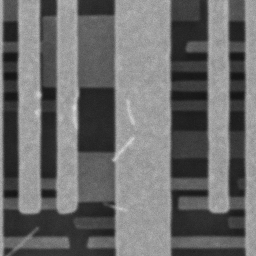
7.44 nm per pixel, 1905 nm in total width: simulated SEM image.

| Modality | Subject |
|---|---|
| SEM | wiring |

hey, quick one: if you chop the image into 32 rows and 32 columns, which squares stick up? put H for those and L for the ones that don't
LLHHHLLHHHLLLLHHHHHHHLLLLLHHLLLH
LLHHHLLHHHLLLLHHHHHHHLLLLLHHHLLH
LLHHHLLHHHLLLLHHHHHHHLLLLLHHHLLH
LLHHHLLHHHLLLLHHHHHHHLLLLLHHHLLH
LLHHHLLHHHLLLLHHHHHHHLLLLLHHHLLH
LLHHHLLHHHLLLLHHHHHHHLLLLLHHHLLH
LLHHHLLHHHLLLLHHHHHHHLLLLLHHHLLH
LLHHHLLHHHLLLLHHHHHHHLLLLLHHHLLH
LLHHHLLHHHLLLLHHHHHHHLLLLLHHHLLH
LLHHHLLHHHLLLLHHHHHHHLLLLLHHHLLH
LLHHHLLHHHLLLLHHHHHHHLLLLLHHHLLH
LLHHHLLHHHLLLLHHHHHHHLLLLLHHHLLH
LLHHHLLHHHLLLLHHHHHHHLLLLLHHHLLH
LLHHHLLHHHLLLLHHHHHHHLLLLLHHHLLH
LLHHHLLHHHLLLLHHHHHHHLLLLLHHHLLH
LLHHHLLHHHLLLLHHHHHHHLLLLLHHHLLH
LLHHHLLHHHLLLLLHHHHHHLLLLLHHHLLH
LLHHHLLHHHLLLLLHHHHHHLLLLLHHHLLH
LLHHHLLHHHLLLLHHHHHHHLLLLLHHHLLH
LLHHHLLHHHLLLLHHHHHHHLLLLLHHHLLH
LLLHHLLHHHLLLLHHHHHHHLLLLLHHHLLH
LLHHHLLHHHLLLLHHHHHHHLLLLLHHHLLH
LLHHHLLHHHLLLLHHHHHHHLLLLLHHLLLH
LLHHHLLHHHLLLLHHHHHHHLLLLLHHHLLH
LLHHHLLHHHLLLLHHHHHHHLLLLLHHHLLH
LLHHHLLHHHLLLLHHHHHHHLLLLLHHHLLH
LLLHHLLLHLLLLLLHHHHHHLLLLLLHLLLH
LLLLLLLLLLLLLLHHHHHHHLLLLLLLLLLH
LLLLLLLLLLLLLLHHHHHHHLLLLLLLLLLH
LLLLLLLLLLLLLLHHHHHHHLLLLLLLLLLH
LLLLLLLLLLLLLLLHHHHHHLLLLLLLLLLH
LLLLLLLLLLLLLLLHHHHHHLLLLLLLLLLH